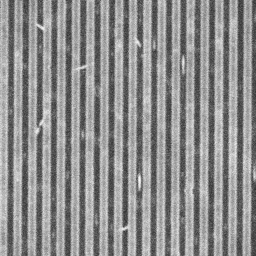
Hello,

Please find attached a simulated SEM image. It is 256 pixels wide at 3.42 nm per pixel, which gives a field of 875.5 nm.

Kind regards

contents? parallel lines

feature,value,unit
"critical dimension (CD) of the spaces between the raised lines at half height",27.4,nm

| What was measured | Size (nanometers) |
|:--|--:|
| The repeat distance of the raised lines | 49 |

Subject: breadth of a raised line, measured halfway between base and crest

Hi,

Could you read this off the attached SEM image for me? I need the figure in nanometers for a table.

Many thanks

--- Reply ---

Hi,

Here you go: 20.5